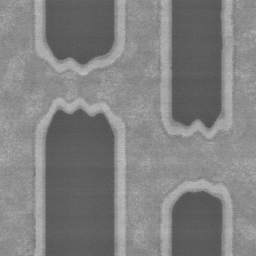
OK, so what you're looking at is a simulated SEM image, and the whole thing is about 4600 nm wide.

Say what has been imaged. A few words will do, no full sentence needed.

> one or a few lines or trenches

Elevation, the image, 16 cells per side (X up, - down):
XX------XX----XX
XX------XX----XX
XX------XX----XX
XXX----XXX----XX
XXXXXXXXXX----XX
XXXXXXXXXX----XX
XXXXXXXXXX----XX
XXX----XXX----XX
XX------XXXXXXXX
XX------XXXXXXXX
XX------XXXXXXXX
XX------XXXXXXXX
XX------XXX---XX
XX------XX----XX
XX------XX----XX
XX------XX----XX